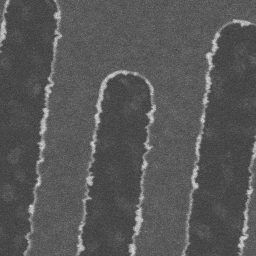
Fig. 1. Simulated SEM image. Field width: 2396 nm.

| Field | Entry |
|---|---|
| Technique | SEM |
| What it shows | one or a few lines or trenches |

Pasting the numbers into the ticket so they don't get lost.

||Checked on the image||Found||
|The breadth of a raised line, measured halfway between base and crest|508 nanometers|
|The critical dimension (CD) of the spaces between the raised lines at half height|0.476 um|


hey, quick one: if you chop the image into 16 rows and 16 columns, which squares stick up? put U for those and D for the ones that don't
DDDDUUUUUUUUUUUU
DDDDUUUUUUUUUUDU
DDDUUUUUUUUUUUDD
DDDUUUUUUUUUUDDD
DDDUUUUUUUUUUDDD
DDDUUUUDDUUUUDDD
DDDUUUDDDUUUUDDD
DDDUUUDDDUUUUDDD
DDDUUUDDDUUUUDDD
DDDUUUDDDUUUDDDD
DDUUUUDDDUUUDDDD
DDUUUUDDDUUUDDDD
DDUUUDDDDUUUDDDU
DDUUUDDDDUUUDDDU
DDUUUDDDUUUUDDDU
DDUUUDDDUUUUDDDU